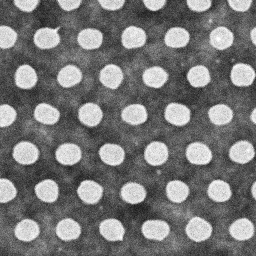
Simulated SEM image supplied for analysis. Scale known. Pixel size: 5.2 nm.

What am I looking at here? a regular array of raised bodies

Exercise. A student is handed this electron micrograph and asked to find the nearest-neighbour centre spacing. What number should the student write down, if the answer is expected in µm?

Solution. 0.221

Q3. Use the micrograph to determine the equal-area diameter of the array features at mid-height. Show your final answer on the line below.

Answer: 0.119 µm